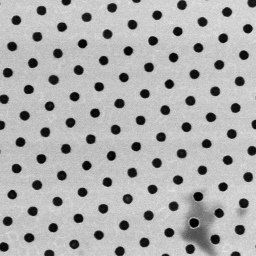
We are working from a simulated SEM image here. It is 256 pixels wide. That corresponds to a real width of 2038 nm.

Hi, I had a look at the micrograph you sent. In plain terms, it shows a regular array of holes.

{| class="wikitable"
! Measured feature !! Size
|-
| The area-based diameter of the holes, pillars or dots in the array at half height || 77.3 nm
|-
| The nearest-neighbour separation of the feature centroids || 26.3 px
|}